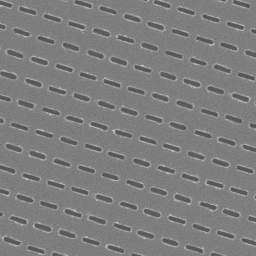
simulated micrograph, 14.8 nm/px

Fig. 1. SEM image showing a regular array of holes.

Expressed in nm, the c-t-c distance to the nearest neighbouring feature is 330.